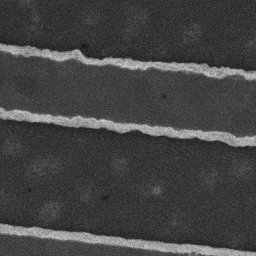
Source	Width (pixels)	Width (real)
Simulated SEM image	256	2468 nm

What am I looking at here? one or a few lines or trenches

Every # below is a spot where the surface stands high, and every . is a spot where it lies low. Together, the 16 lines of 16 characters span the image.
................
................
................
###.#...........
#############.#.
################
################
...#############
.............###
................
................
................
................
................
##..............
###########.....